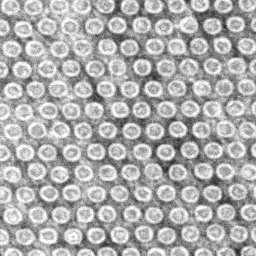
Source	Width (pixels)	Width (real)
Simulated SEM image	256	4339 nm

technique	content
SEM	a regular array of raised bodies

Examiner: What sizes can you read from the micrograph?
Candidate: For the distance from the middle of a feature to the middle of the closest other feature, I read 382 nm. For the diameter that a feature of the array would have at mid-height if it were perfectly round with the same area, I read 0.266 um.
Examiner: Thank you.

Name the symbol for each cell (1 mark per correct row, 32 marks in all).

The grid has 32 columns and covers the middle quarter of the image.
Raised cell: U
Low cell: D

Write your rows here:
UUUUDDUUUUDDUUUDDDUUUUDDUUUDDUUU
UUUUDDUUUUDDUUUDDDUUUDDDUUUDDDUU
DUUDDDUUUDDDDUDDDDDUUDDDDUDDDDDD
DDDDDDDDDDDDDDDDDDDDDDDDDDDDDDDD
DDDDDDDDDDUDDDDDDDDDDDDDDDDUUDDD
DDDUUUDDDUUUDDDUUUDDDUUUDDUUUUDD
DDDUUUUDDUUUDDDUUUDDUUUUDDUUUUDD
DDDUUUUDDUUUDDDUUUDDDUUUDDDUUUDD
DDDDDDDDDDDDDDDDDDDDDDDDDDDDDDDD
DDDDDDDDDDDDDDDDDDDDDDDDDDDDDDDD
UUUDDDUUUDDDUUUUDDUUUDDDUUUDDDUU
UUUUDDUUUUDDUUUUDUUUUDDDUUUUDDUU
UUUUDDUUUDDDDUUUDDUUUDDDUUUDDDUU
DDDDDDDDDDDDDDDDDDDDDDDDDDDDDDDD
DDDDDDDDDDDDDDDDDDDDDDDDDDDDDDDD
UDDUUUDDDUUUUDDUUUDDDUUUDDDUUUDD
UDDUUUUDDUUUUDDUUUUDDUUUUDDUUUDD
UDDUUUUDDUUUUDDUUUUDDUUUUDDUUUDD
DDDDUUDDDDDDDDDDDDDDDDUUDDDDDDDD
DDDDDDDDDDDDDDDDDDDDDDDDDDDDDDDD
DUUDDDDUUDDDUUDDDDDUUDDDUUDDDDUU
UUUUDDUUUUDUUUUDDDUUUUDDUUUDDDUU
UUUUDDUUUUDUUUUDDDUUUUDDUUUDDDUU
DUUDDDDDUDDDDUDDDDDUUDDDDUUDDDDD
DDDDDDDDDDDDDDDDDDDDDDDDDDDDDDDD
DDDDDDDDDDDDDDDUUUDDDUUDDDDUUDDD
DDDUUUUDDUUUUDDUUUUDUUUUDDUUUUDD
UDDUUUUDDUUUUDDUUUUDDUUUDDUUUUDD
UDDDUUDDDUUUUDDDUUDDDDDDDDDUUUDD
DDDDDDDDDDDDDDDDDDDDDDDDDDDDDDDD
DDDDDDDDDDDDDDDDDDDDDDDDDDDDDDDD
UUUUDDDUUUDDUUUDDDUUUDDDUUUDDDUU